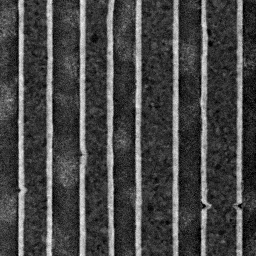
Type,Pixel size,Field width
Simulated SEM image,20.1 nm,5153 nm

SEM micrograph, one or a few lines or trenches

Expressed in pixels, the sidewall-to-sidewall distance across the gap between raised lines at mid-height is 28.5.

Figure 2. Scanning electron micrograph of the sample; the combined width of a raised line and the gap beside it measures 62.2 pixels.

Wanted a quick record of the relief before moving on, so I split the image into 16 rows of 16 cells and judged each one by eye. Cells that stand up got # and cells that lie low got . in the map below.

.##..##..##..##.
.##..##..##..##.
.##..##..##..##.
.##..##..##..##.
.##..##..##..##.
.##..##..##..##.
.##..##..##..##.
.##..##..##..##.
.##..##..##..##.
.##..##..##..##.
.##..##..##..##.
.##..##..##..##.
.##..##..##..##.
.##..##..##..##.
.##..##..##..##.
.##..##..##..##.